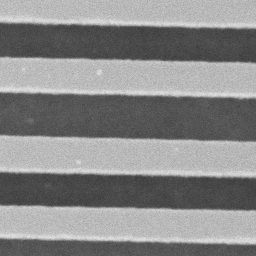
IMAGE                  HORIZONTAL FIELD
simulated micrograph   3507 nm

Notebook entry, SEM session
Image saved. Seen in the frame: lines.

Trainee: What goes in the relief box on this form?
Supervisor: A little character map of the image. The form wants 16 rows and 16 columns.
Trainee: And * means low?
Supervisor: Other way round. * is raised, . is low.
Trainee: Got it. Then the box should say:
****************
....************
................
................
****************
****************
................
................
................
****************
****************
................
................
****************
****************
................